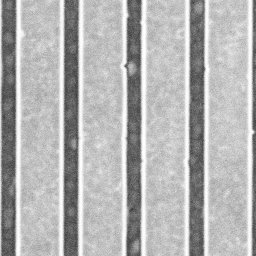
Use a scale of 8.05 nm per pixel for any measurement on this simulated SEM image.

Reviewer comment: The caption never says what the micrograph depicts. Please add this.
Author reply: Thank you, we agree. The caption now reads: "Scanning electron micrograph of one or a few lines or trenches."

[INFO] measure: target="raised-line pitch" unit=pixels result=62.7